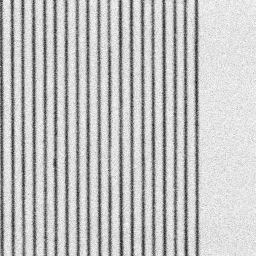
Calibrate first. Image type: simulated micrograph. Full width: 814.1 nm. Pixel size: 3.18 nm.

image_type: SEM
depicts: parallel lines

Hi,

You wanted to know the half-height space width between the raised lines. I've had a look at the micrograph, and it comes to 7.9 nm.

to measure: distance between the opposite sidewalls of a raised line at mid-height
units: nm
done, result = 27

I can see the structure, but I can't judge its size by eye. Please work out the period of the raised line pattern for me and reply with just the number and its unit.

34.4 nm